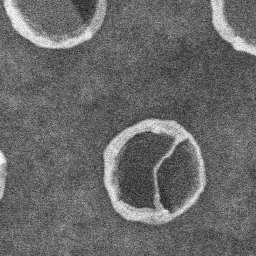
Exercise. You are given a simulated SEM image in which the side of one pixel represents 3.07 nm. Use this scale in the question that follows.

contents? raised bodies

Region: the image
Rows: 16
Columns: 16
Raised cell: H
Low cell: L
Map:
LHHHHHLLLLLLLHHH
LHHHHHLLLLLLLLHH
LLHHHLLLLLLLLLHH
LLLLLLLLLLLLLLLL
LLLLLLLLLLLLLLLL
LLLLLLLLLLLLLLLL
LLLLLLLLLLLLLLLL
LLLLLLLLLLLLLLLL
LLLLLLLHHHHLLLLL
LLLLLLLHHHHLLLLL
LLLLLLLHHHLLLLLL
LLLLLLLHHHLLLLLL
LLLLLLLHHHLLLLLL
LLLLLLLLHHLLLLLL
LLLLLLLLLLLLLLLL
LLLLLLLLLLLLLLLL